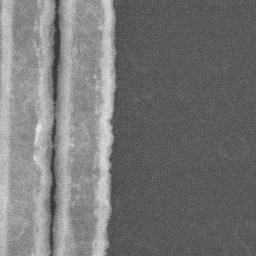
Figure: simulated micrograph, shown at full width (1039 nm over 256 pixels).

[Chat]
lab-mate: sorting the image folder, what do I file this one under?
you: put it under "one or a few lines or trenches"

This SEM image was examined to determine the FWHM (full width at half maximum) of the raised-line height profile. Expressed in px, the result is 41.